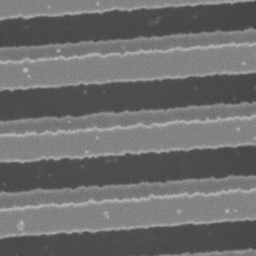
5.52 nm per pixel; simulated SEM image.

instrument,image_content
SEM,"lines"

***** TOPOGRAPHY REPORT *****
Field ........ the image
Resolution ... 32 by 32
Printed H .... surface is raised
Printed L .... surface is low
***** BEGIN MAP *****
HHHHHHHHHHHHHHHHHHHHHHHHHLLLLLLL
HHHHHHHHHHHHHLLLLLLLLLLLLLLLLLLL
LLLLLLLLLLLLLLLLLLLLLLLLLLLLLLLL
LLLLLLLLLLLLLLLLLLLLLLLLLLLLLLLL
LLLLLLLLLLLLLLLLLLLLLHHHHHHHHHHH
LLLLLLLLHHHHHHHHHHHHHHHHHHHHHHHH
HHHHHHHHHHHHHHHHHHHHHHHHHHHHHHHH
HHHHHHHHHHHHHHHHHHHHHHHHHHHHHHHH
HHHHHHHHHHHHHHHHHHHHHHHHHHHHHHHH
HHHHHHHHHHHHHHHHHHHHHHHHHHLLLLLL
HHHHHHHHHHHLLLLLLLLLLLLLLLLLLLLL
LLLLLLLLLLLLLLLLLLLLLLLLLLLLLLLL
LLLLLLLLLLLLLLLLLLLLLLLLLLLLLLLL
LLLLLLLLLLLLLLLLLLLLLLLHHHHHHHHH
LLLLLLLLLLHHHHHHHHHHHHHHHHHHHHHH
HHHHHHHHHHHHHHHHHHHHHHHHHHHHHHHH
HHHHHHHHHHHHHHHHHHHHHHHHHHHHHHHH
HHHHHHHHHHHHHHHHHHHHHHHHHHHHHHHH
HHHHHHHHHHHHHHHHHHHHHHHHHHLLLLLL
HHHHHHHHHHHHLLLLLLLLLLLLLLLLLLLL
LLLLLLLLLLLLLLLLLLLLLLLLLLLLLLLL
LLLLLLLLLLLLLLLLLLLLLLLLLLLLLLLL
LLLLLLLLLLLLLLLLLLLLLLLHHHHHHHHH
LLLLLLLLLLHHHHHHHHHHHHHHHHHHHHHH
HHHHHHHHHHHHHHHHHHHHHHHHHHHHHHHH
HHHHHHHHHHHHHHHHHHHHHHHHHHHHHHHH
HHHHHHHHHHHHHHHHHHHHHHHHHHHHHHHH
HHHHHHHHHHHHHHHHHHHHHHHHHHHHHHHH
HHHHHHHHHHHHHHHHHHLLLLLLLLLLLLLL
HLLLLLLLLLLLLLLLLLLLLLLLLLLLLLLL
LLLLLLLLLLLLLLLLLLLLLLLLLLLLLLLL
LLLLLLLLLLLLLLLLLLLLLLLLLLLLHHHH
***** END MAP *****